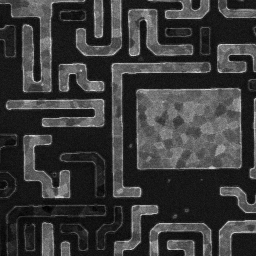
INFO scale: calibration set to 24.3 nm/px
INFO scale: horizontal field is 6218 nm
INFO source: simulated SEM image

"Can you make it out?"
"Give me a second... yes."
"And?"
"wiring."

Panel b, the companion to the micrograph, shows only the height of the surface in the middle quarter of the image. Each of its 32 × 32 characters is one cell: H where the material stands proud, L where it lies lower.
HHHHHLLLLLLLHHHHHHHHHHHHHHHHHHHH
HHHHHHLLLLLLHHHHHHHHHHHHHHHHHHHH
HHHHHHLLLLLLHHHLLLLLLLLLLLLLLLLL
HLLHHHLLLLLLHHLLLLLLLLLLLLLLLLLL
HLLHHHHHHHLLHHLLLLLLLLLLLLLLLLLL
HLLLHHHHHHLLHHLLLLLLLLLLLLLLLLLL
HLLLLHHHHHLLHHLLLLLHHHHHHHHHHHHH
LLLLLLLLLLLLHHLLLLHHHHHHHHHHHHHH
LLLLLLLLLLLLHHLLLLHHHHHHHHHHHHHH
HHHHHHHHHHLLHHLLLLHHHHHHHHHHHHHH
HHHHHHHHHHLLHHLLLLHHHHHHHHHHHHHH
LLLLLLLLHHLLHHLLLLHHHHHHHHHHHHHH
LLLLLLLLHHLLHHLLLLHHHHHHHHHHHHHH
HHHHHHHHHHLLHHLLLLHHHHHHHHHHHHHH
HHHHHHHHHHLLHHHLLLHHHHHHHHHHHHHH
HHHHHHHHHHLLHHHLLLHHHHHHHHHHHHHH
LLLLLLLLLLLLHHHLLLHHHHHHHHHHHHHH
LLLLLLLLLLLLHHHLLLHHHHHHHHHHHHHH
LLLLLLLLLLLLHHHLLLHHHHHHHHHHHHHH
LLLLLLLLLLLLHHHLLLHHHHHHHHHHHHHH
LLLLLLLLLLLLHHHLLLLHHHHHHHHHHHHH
LLLLLLLLLLLLHHHLLLLHHHHHHHHHHHHH
HHHHHHHHHLLLHHHLLLLHHHHHHHHHHHHH
HHHHHHHHHLLLHHHLLLLHHHHHHHHHHHHH
LLLLLLLHHHLLHHHLLLLHHHHHHHHHHHHH
LLLLLLLLHHLLHHHLLLLHHHHHHHHHHHHH
LLLLLLLLHHLLHHHLLLLLLLLLLLLLLLLL
HLLLLLLLHHLLHHHLLLLLLLLLLLLLLLLL
HLLLLLLLHHLLHHHLLLLLLLLLLLLLLLLL
HLLLLLLLHHLLHHHLLLLLLLLLLLLLLLLL
HLLLLLLLHHLLHHHLLLLLLLLLLLLLLLLL
HLLLLLLLHHLLHHHHHHHLLLLLLLLLLLLL